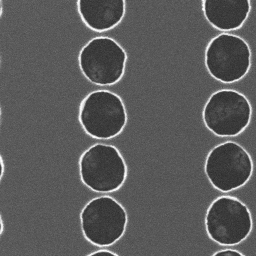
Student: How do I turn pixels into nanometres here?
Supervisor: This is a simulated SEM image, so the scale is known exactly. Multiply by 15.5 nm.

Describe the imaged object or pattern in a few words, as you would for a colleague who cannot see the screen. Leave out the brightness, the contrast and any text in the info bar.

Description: a regular array of holes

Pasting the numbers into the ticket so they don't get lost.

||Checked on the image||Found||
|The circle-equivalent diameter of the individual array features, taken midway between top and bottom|702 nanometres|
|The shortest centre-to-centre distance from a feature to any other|831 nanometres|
